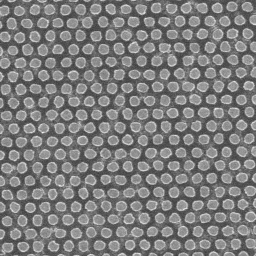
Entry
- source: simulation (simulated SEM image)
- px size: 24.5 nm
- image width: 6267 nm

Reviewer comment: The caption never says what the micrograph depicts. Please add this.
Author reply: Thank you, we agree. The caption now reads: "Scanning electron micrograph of a regular array of raised bodies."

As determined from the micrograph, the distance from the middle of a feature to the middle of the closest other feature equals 0.358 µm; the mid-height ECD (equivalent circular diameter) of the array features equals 241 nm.